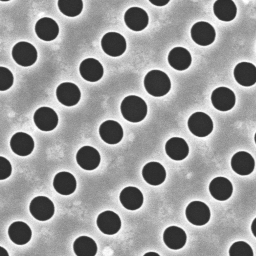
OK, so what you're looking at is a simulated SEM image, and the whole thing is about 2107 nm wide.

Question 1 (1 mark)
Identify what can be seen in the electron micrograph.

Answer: a regular array of holes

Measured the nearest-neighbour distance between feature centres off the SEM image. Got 276 nanometres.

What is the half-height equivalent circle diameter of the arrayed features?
200 nm